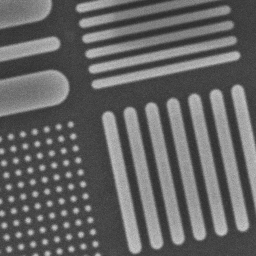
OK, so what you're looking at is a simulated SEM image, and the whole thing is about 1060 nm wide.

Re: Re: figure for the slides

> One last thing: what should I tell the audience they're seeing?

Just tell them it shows groups of lines, slits or small figures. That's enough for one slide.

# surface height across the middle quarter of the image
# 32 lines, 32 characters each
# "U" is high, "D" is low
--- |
DDDDDDDUUUUUUUUUDDDDDDDDDUUUUUUU
DDDDDDUUUUUDDDDDDDDDDUUUUUUUUUDD
DDDDDDDDDDDDDDDDUUUUUUUUUUDDDDDD
DDDDDDDDDDDUUUUUUUUUUDDDDDDDDDDD
UDDDDDDUUUUUUUUUDDDDDDDDDDDDDDDD
UDDDDDDUUUUUDDDDDDDDDDDDDDDDDDDD
UDDDDDDDDDDDDDDDDDDDDDDDDDDDDDDD
UDDDDDDDDDDDDDDDDDDDDDDDDDDDDDDD
DDDDDDDDDDDDDDDDDDDDDDDDDDDDDDDU
DDDDDDDDDDDDDDDDDDDDDDDDDDUUDDDU
DDDDDDDDDDDDDDDDDDDDDUUDDDUUUDDU
DDDDDDDDDDDDDDDUUUDDDUUUDDUUUDDD
DDDDDDDDDDUUDDDUUUDDDUUUDDUUUDDD
DDDDDDDDDDUUUDDUUUDDDUUUDDDUUDDD
DDDDDDDDDDUUUDDUUUDDDUUUDDDUUUDD
DUDDDDDDDDUUUDDDUUUDDUUUDDDUUUDD
DDDDDDDDDDUUUDDDUUUDDUUUUDDUUUDD
DDDDDDDDDDDUUDDDUUUDDDUUUDDUUUDD
DDUDDDDDDDDUUUDDUUUDDDUUUDDDUUDD
DDDDDDDDDDDUUUDDUUUDDDUUUDDDUUUD
DDDDDDDDDDDUUUDDDUUUDDUUUDDDUUUD
DDDDDDDDDDDUUUDDDUUUDDDUUUDDUUUD
DDDDDDDDDDDDUUDDDUUUDDDUUUDDUUUD
DDDDDDDDDDDDUUUDDUUUDDDUUUDDUUUD
UDDUDDDDDDDDUUUDDUUUUDDUUUDDDUUU
DDDDDDDDDDDDUUUDDDUUUDDUUUDDDUUU
DDDDDDDDDDDDUUUDDDUUUDDDUUUDDUUU
DUDDDDDDDDDDUUUDDDUUUDDDUUUDDUUU
DDDDDDDDDDDDDUUUDDUUUDDDUUUDDUUU
DDDDUDDDDDDDDUUUDDDUUUDDUUUDDDUU
DUDDUDDDDDDDDUUUDDDUUUDDUUUDDDUU
DDDDDDDDDDDDDUUUDDDUUUDDDUUUDDUU